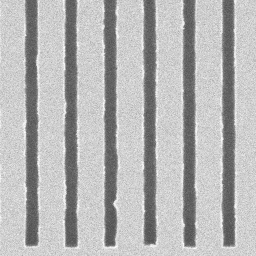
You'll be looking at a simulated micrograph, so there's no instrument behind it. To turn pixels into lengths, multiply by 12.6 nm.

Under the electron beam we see parallel lines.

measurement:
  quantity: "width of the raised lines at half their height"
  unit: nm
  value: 361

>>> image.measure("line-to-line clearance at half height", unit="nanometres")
140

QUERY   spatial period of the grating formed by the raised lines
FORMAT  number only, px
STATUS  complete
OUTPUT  39.4